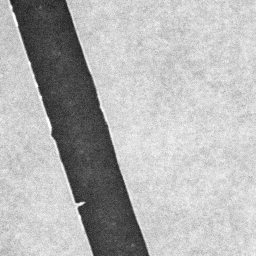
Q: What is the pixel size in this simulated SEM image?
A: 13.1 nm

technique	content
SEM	one or a few lines or trenches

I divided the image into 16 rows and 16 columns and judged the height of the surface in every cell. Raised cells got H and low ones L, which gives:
HLLLHHHHHHHHHHHH
HLLLLHHHHHHHHHHH
HLLLLHHHHHHHHHHH
HHLLLHHHHHHHHHHH
HHLLLLHHHHHHHHHH
HHLLLLHHHHHHHHHH
HHHLLLHHHHHHHHHH
HHHLLLLHHHHHHHHH
HHHLLLLHHHHHHHHH
HHHHLLLHHHHHHHHH
HHHHLLLHHHHHHHHH
HHHHLLLLHHHHHHHH
HHHHHLLLHHHHHHHH
HHHHHLLLHHHHHHHH
HHHHHLLLLHHHHHHH
HHHHHHLLLHHHHHHH